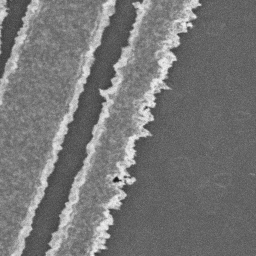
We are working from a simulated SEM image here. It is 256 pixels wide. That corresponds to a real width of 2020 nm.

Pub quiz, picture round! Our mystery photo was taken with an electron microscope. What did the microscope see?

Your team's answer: one or a few lines or trenches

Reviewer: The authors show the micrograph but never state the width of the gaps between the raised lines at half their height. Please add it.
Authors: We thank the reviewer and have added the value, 250 nm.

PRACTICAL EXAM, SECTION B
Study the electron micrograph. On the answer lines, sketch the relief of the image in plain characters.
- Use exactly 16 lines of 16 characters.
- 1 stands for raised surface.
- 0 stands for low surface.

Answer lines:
0011111001110000
0011110001100000
0111110011100000
0111110011100000
0111100111000000
1111100111000000
1111100110000000
1111001110000000
1111001110000000
1111001100000000
1110011100000000
1110011000000000
1100011000000000
1100111000000000
1100110000000000
1001110000000000